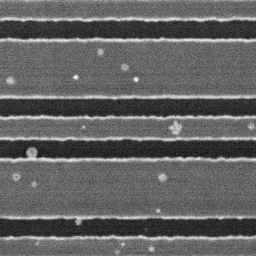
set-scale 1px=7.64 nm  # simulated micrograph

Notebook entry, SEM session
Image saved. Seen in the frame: lines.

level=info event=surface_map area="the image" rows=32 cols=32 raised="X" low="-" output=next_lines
XXXXXXXXXXXXXXXXXXXXXXXXXXXXXXXX
XXXXXXXXXXXXXXXXXXXXXXXXXXXXXXXX
--X-XXXXX-XX------XXX--XXX-XX---
--------------------------------
--------------------------------
XXXXXXXXXXXXXXXXXXXXXXXXXXXXXXXX
XXXXXXXXXXXXXXXXXXXXXXXXXXXXXXXX
XXXXXXXXXXXXXXXXXXXXXXXXXXXXXXXX
XXXXXXXXXXXXXXXXXXXXXXXXXXXXXXXX
XXXXXXXXXXXXXXXXXXXXXXXXXXXXXXXX
XXXXXXXXXXXXXXXXXXXXXXXXXXXXXXXX
XXXXXXXXXXXXXXXXXXXXXXXXXXXXXXXX
--------------------------------
--------------------------------
-----X--------------------------
XXXXXXXXXXXXXXXXXXXXXXXXXXXXXXXX
XXXXXXXXXXXXXXXXXXXXXXXXXXXXXXXX
-X-----X--XXX----X--XX-X--------
--------------------------------
--------------------------------
XXXXXXXXXXXXXXXXXXXXXXXXXXXXXXXX
XXXXXXXXXXXXXXXXXXXXXXXXXXXXXXXX
XXXXXXXXXXXXXXXXXXXXXXXXXXXXXXXX
XXXXXXXXXXXXXXXXXXXXXXXXXXXXXXXX
XXXXXXXXXXXXXXXXXXXXXXXXXXXXXXXX
XXXXXXXXXXXXXXXXXXXXXXXXXXXXXXXX
XXXXXXXXXXXXXXXXXXXXXXXXXXXXXXXX
--------------------------------
--------------------------------
--------------------------------
XXXXXXXXXXXXXXXXXXXXXXXXXXXXXXXX
XXXXXXXXXXXXXXXXXXXXXXXXXXXXXXXX